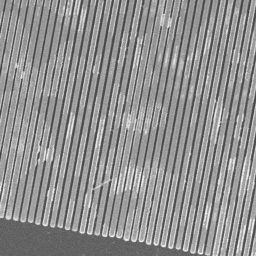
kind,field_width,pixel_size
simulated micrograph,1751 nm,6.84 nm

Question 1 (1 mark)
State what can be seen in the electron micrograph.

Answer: parallel lines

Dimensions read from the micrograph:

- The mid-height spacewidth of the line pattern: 16.8 nm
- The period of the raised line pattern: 51.4 nm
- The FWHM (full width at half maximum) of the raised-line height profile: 34.4 nanometers